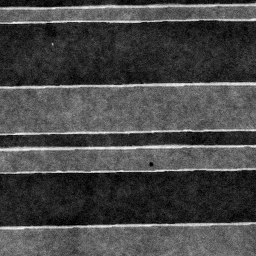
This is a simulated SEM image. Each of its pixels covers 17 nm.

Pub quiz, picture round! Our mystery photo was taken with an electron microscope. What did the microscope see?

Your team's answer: lines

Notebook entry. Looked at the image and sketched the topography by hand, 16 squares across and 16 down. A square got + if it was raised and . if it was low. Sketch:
++++++++++++++++
................
................
................
................
..++++++++++++++
++++++++++++++++
++++++++++++++++
++++++++++++++++
++++++++++++++++
++++++++++++++++
................
................
................
++++++++++++++++
++++++++++++++++